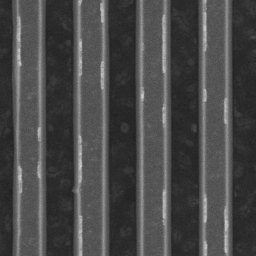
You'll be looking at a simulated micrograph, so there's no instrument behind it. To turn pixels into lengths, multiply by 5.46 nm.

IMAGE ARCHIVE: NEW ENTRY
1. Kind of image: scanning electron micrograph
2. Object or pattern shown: one or a few lines or trenches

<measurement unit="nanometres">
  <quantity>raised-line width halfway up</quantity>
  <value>157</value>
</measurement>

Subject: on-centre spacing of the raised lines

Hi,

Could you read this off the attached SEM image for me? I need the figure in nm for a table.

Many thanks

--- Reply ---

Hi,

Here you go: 339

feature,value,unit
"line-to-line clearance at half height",180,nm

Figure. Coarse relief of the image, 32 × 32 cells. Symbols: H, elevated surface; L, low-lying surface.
LLHHHLLLLLHHHLLLLHHHHLLLLHHHHLLL
LLHHHLLLLLHHHLLLLHHHHLLLLHHHHLLL
LLHHHLLLLLHHHLLLLHHHHLLLLHHHHLLL
LLHHHLLLLLHHHLLLLHHHHLLLLHHHHLLL
LLHHHLLLLLHHHLLLLHHHHLLLLHHHHLLL
LLHHHLLLLLHHHLLLLHHHHLLLLHHHHLLL
LLHHHLLLLLHHHLLLLHHHHLLLLHHHHLLL
LLHHHLLLLLHHHLLLLHHHHLLLLHHHHLLL
LLHHHLLLLLHHHLLLLHHHHLLLLHHHHLLL
LLHHHLLLLLHHHLLLLHHHHLLLLHHHHLLL
LLHHHLLLLLHHHLLLLHHHHLLLLHHHHLLL
LLHHHLLLLLHHHLLLLHHHHLLLLHHHHLLL
LLHHHLLLLLHHHLLLLHHHHLLLLHHHHLLL
LLHHHLLLLLHHHLLLLHHHHLLLLHHHHLLL
LLHHHLLLLLHHHLLLLHHHHLLLLHHHHLLL
LLHHHLLLLLHHHLLLLHHHHLLLLHHHHLLL
LLHHHLLLLLHHHLLLLHHHHLLLLHHHHLLL
LLHHHLLLLLHHHLLLLHHHHLLLLHHHHLLL
LLHHHLLLLLHHHLLLLHHHHLLLLHHHHLLL
LLHHHLLLLLHHHLLLLHHHHLLLLHHHHLLL
LLHHHLLLLLHHHLLLLHHHHLLLLHHHHLLL
LLHHHLLLLLHHHLLLLHHHHLLLLHHHHLLL
LLHHHLLLLLHHHLLLLHHHHLLLLHHHHLLL
LLHHHLLLLHHHHLLLLHHHHLLLLHHHHLLL
LLHHHLLLLHHHHLLLLHHHHLLLLHHHHLLL
LLHHHLLLLLHHHLLLLLHHHLLLLHHHHLLL
LLHHHLLLLLHHHLLLLLHHHLLLLHHHHLLL
LLHHHLLLLLHHHLLLLLHHHLLLLHHHHLLL
LLHHHLLLLLHHHLLLLLHHHLLLLHHHHLLL
LLHHHLLLLLHHHLLLLLHHHLLLLHHHHLLL
LLHHHLLLLLHHHLLLLLHHHLLLLHHHHLLL
LLHHHLLLLLHHHLLLLLHHHLLLLHHHHLLL